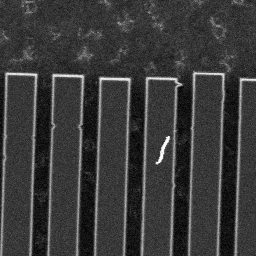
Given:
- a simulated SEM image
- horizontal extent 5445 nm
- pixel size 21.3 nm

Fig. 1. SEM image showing parallel lines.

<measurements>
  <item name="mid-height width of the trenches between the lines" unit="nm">369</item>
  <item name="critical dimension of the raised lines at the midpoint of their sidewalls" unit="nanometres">627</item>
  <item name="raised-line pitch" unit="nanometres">997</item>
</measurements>